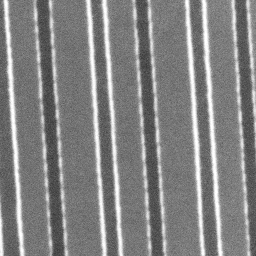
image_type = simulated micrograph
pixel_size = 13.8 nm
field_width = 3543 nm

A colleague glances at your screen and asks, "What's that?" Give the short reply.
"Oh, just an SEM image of lines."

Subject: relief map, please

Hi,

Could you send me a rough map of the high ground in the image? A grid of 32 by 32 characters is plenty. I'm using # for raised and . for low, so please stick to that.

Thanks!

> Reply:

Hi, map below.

.###..#####..####..####..####..#
.####.#####..####..####...###..#
.####.#####..####..####...###..#
.####.#####..####..#####..###..#
.####.#####..####..#####..###..#
.####..####..####..#####..###..#
.####..####..####..#####..####.#
.####..####...###..#####..####.#
.####..#####..###..#####..####..
.####..#####..###..#####..####..
.####..#####..###..#####..####..
.####..#####..####.#####..####..
..###..#####..####.#####..####..
..###..#####..####..####..####..
..###..#####..####..####..####..
..###..#####..####..####..####..
..###..#####..####..####...###..
..####.#####..####..####...###..
..####.#####..####..#####..###..
..####.#####..####..#####..###..
..####..####..####..#####..###..
..####..####..####..#####..###..
..####..####...###..#####..####.
..####..#####..###..#####..####.
..####..#####..###..#####..####.
..####..#####..###..#####..####.
..####..#####..###..#####..####.
..####..#####..####.#####..####.
...###..#####..####.#####..####.
...###..#####..####..####..####.
...###..#####..####..####..####.
...###..#####..####..####..####.